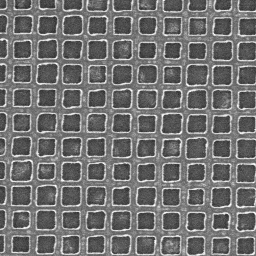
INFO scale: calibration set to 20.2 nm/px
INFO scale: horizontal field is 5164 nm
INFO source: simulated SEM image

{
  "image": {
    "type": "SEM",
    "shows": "a regular array of holes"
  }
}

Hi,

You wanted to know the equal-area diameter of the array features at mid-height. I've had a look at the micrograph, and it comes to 0.395 micrometres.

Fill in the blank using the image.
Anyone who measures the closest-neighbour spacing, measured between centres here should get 490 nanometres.